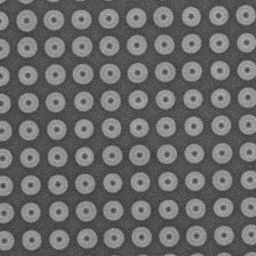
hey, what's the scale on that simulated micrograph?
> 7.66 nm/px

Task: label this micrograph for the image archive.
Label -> an array of small figures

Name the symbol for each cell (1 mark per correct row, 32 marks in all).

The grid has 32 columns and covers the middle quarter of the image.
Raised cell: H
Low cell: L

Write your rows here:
LLLHHHLLLLHHHLLLLHHHLLLHHHHLLLHH
LLHHHHHLLHHHHHLLHHHHHLLHHHHHLLHH
LLHHHHHLLHHHHHLLHHHHHLLHHHHHLLHH
LLHHHHHLLHHHHHLLHHHHLLLHHHHLLLHH
LLLHHHLLLLHHHLLLLLHLLLLLLLLLLLLL
LLLLLLLLLLLLLLLLLLLLLLLLLLLLLLLL
LLLLLLLLLLLLLLLLLLLLLLLLLLLLLLLL
LLLLHHHLLLHHHHLLLHHHLLLHHHHLLLHH
LLLHHHHLLHHHHHLLHHHHHLLHHHHHLLHH
LLLHHHHLLHHHHHLLHHHHHLLHHHHHLLHH
LLLHHHHLLLHHHHLLLHHHLLLLHHHLLLLH
LLLLHHLLLLLHHLLLLLLLLLLLLLLLLLLL
LLLLLLLLLLLLLLLLLLLLLLLLLLLLLLLL
LLLLLLLLLLLLLLLLLLLLLLLLLHLLLLLH
LLLHHHHLLLHHHHLLLHHHHLLHHHHHLLHH
LLLHHHHLLLHHHHLLLHHHHLLHHHHHLLHH
LLLHHHHLLLHHHHLLLHHHHLLHHHHHLLHH
LLLHHHHLLLHHHHLLLHHHHLLLHHHLLLLH
LLLLHHLLLLLLLLLLLLLLLLLLLLLLLLLL
LLLLLLLLLLLLLLLLLLLLLLLLLLLLLLLL
LLLLLLLLLLLLHLLLLLHHLLLLLHHLLLLH
LLLLHHHLLLHHHHLLLHHHHLLLHHHHLLHH
HLLHHHHLLLHHHHLLHHHHHLLHHHHHLLHH
HLLHHHHLLLHHHHLLHHHHHLLHHHHHLLLH
HLLHHHHLLLHHHHLLLHHHHLLLHHHLLLLH
LLLLLLLLLLLLLLLLLLLLLLLLLLLLLLLL
LLLLLLLLLLLLLLLLLLLLLLLLLLLLLLLL
LLLLLLLLLLLLLLLLLLHHLLLLLHHLLLLH
LLLHHHHLLLHHHHLLLHHHHLLLHHHHLLLH
HLLHHHHHLLHHHHLLLHHHHLLLHHHHLLHH
HLLHHHHHLLHHHHLLLHHHHLLLHHHHLLLH
LLLHHHHLLLLHHHLLLLHHHLLLLHHLLLLL